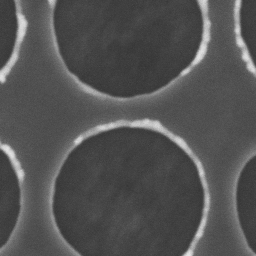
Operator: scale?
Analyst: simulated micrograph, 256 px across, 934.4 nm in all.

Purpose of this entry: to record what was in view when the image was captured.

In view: holes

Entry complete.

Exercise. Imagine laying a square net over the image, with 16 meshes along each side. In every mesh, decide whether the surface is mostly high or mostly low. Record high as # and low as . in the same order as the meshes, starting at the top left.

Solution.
.##.........###.
.##..........##.
.###.........##.
.###........####
####.......#####
######....######
################
################
######....######
####........####
.###........###.
.##..........##.
.##..........##.
.##..........##.
.###........###.
#####.......####